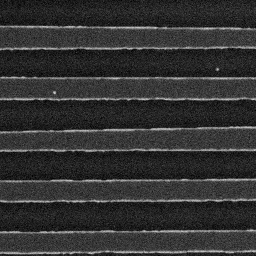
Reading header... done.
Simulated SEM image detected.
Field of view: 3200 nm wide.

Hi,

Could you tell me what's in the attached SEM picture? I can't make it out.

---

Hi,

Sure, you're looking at lines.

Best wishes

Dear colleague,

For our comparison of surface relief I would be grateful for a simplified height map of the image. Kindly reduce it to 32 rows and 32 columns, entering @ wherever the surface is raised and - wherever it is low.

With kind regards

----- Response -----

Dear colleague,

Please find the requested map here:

--------------------------------
--------------------------------
--------------------------------
@@@@@@@@@@@@@@@@@@@@------------
@@@@@@@@@@@@@@@@@@@@@@@@@@@@@@@@
@@@@@@@@@@@@@@@@@@@@@@@@@@@@@@@@
--------------------------------
--------------------------------
--------------------------------
--------------------------------
@@@@@@@@@@@@@@@@@@@@@@@@@@@@@@@@
@@@@@@@@@@@@@@@@@@@@@@@@@@@@@@@@
-------@------------------------
--------------------------------
--------------------------------
--------------------------------
---@@@@@@@@@@@@@@@@@@@@@@@@@@@@@
@@@@@@@@@@@@@@@@@@@@@@@@@@@@@@@@
@@@@@@@@@@@@@@@@@@@@@@@@@@@@@@@@
--------------------------------
--------------------------------
--------------------------------
----------------------@@-@@@@@@@
@@@@@@@@@@@@@@@@@@@@@@@@@@@@@@@@
@@@@@@@@@@@@@@@@@@@@@@@@@@@@@@@@
--------------------------------
--------------------------------
--------------------------------
--------------------------------
@@@@@@@@@@@@@@@@@@@@@@@@@@@@@@@@
@@@@@@@@@@@@@@@@@@@@@@@@@@@@@@@@
@@@@@@@@@@@@@-@@@@@@@@@@----@@--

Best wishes